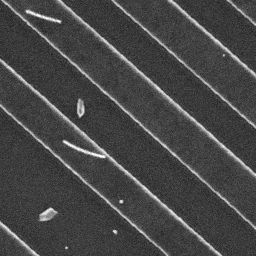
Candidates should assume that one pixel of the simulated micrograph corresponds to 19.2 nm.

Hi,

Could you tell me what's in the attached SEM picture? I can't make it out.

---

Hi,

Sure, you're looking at lines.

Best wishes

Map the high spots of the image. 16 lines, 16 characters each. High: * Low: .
.***....***....*
..***....***....
...****...****..
....****...****.
*....****...****
**....****...***
***....****...**
.***....****...*
..***.....***...
...***.....***..
....****....****
.....****....***
.......***....**
........***....*
*........***....
**........***...